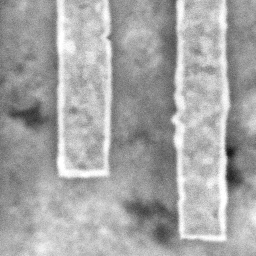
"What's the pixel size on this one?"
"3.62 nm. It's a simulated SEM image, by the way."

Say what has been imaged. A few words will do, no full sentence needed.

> one or a few lines or trenches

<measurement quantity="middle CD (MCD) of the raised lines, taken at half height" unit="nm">166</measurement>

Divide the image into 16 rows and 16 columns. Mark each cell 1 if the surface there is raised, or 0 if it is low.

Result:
0000111000011100
0000111000011100
0000111000011100
0000111000011100
0000111000011100
0000111000011100
0000111000011100
0000111000011100
0000111000011100
0000111000011100
0000111000011100
0000000000011100
0000000000011100
0000000000011100
0000000000011100
0000000000000000